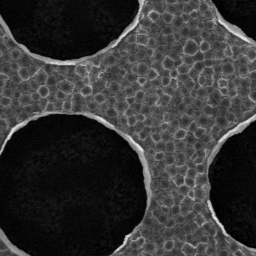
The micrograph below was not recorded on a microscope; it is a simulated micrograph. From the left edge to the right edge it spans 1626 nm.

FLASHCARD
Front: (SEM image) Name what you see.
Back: holes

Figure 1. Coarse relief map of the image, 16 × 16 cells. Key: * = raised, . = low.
.........*****..
........******..
*......*********
***...**********
****************
****************
****************
**....**********
*.......******..
.........****...
.........****...
.........****...
.........****...
.........*****..
........******..
*......*********